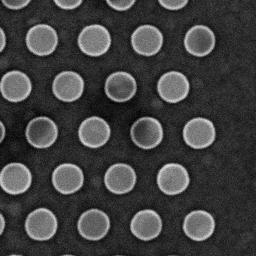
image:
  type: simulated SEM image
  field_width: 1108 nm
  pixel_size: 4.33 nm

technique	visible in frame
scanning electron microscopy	a regular array of raised bodies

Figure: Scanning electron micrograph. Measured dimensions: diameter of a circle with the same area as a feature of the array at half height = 132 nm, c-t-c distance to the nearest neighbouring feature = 227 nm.